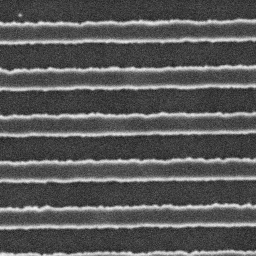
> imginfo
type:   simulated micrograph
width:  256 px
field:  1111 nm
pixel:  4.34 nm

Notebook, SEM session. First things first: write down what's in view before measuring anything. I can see lines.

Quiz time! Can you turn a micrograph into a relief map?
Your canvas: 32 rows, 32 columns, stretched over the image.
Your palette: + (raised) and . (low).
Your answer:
................................
................................
..............................+.
++++++++++++++++++++++++++++++++
++++++++++++++++++++++++++++++++
.+..............................
................................
................................
......................++++++++++
++++++++++++++++++++++++++++++++
++++++++++++++++++++++++++++++++
................................
................................
................................
.+++++++++++++++++++++++++++++++
++++++++++++++++++++++++++++++++
++++++++++++++++++++++++++++++++
................................
................................
................................
++++++++++++++++++++++++++++++++
++++++++++++++++++++++++++++++++
+++++++++++++++++++.............
................................
................................
................................
++++++++++++++++++++++++++++++++
++++++++++++++++++++++++++++++++
++.+............................
................................
................................
...................+..+..+++++++